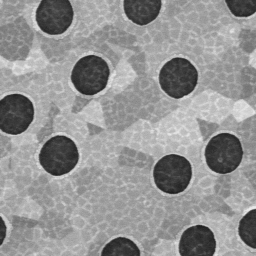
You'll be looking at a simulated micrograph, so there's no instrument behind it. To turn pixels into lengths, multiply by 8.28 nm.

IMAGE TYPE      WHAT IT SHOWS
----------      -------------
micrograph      holes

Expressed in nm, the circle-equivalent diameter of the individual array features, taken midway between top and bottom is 334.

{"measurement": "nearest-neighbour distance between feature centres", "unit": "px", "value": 86.7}